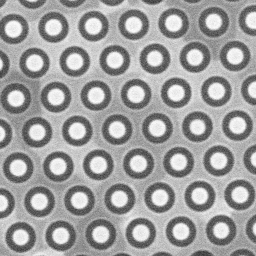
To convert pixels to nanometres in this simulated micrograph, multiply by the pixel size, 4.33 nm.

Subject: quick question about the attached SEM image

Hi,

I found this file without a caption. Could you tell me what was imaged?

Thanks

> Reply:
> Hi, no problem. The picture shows an array of small figures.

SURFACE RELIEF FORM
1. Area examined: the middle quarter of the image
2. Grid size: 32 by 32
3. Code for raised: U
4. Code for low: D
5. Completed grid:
DUUUDDUUUDDUUUDDUUUDDDDDDDUUUDDD
DDDDDDUUUUDDDDDDUUUUDDDDDDUUUUDD
DDDDDUUUUUUDDDDUUUUUUUDDUUUUUUUU
UUUUUUUUUUUUUUUUUUUUUUUUUUUDDUUU
UUUUUUDDDDUUUUUUDDDDUUUUUDDDDDDU
DUUUUDDDDDDUUUUDDDDDDUUUDDDUUDDD
DUUUDDDUUDDDUUDDUUUUDDUUDDUUUUDD
DDUUDDUUUUDDUUDDUUUUDDUUDDUUUUDD
DDUUDDUUUUDDUUDDUUUUDDUUDDDUUUDD
DDUUDDDUUDDDUUUDDDDDDDUUUDDDDDDU
DUUUUDDDDDDUUUUDDDDDDUUUUUDDDDUU
UUUUUUDDDDUUUUUUUUDUUUUUUUUUUUUU
UUUUUUUUUUUUUDUUUUUUUDDDDUUUUUUD
UDDDDDUUUUUDDDDDUUUUDDDDDDUUUUDD
DDDDDDDUUUDDDDDDDUUUDDUUUDDUUDDD
DDUUUDDUUDDDUUUDDUUDDUUUUDDUUDDD
DUUUUDDUUDDUUUUDDUUDDUUUUDDUUDDD
DUUUUDDUUDDDUUUDDUUUDDUUUDDUUUDD
DDUUDDDUUUDDDDDDDUUUDDDDDDUUUUDD
DDDDDDUUUUUDDDDDUUUUUDDDDUUUUUUU
UUDDUUUUUUUUUUDUUUUUUUUUUUUUDUUU
UUUUUUUDDDUUUUDDUDDDDUUUUUDDDDDU
DUUUUUDDDDDUUUUDDDDDDDUUUDDDDDDD
DDUUUDDDUDDDUUUDDUUUDDUUUDDUUUDD
DDUUUDDUUUDDDUUDDUUUDDDUUDDUUUDD
DDDUUDDUUUDDDUUDDUUUDDDUUDDUUUDD
DDUUUDDUUUDDUUUDDUUUDDUUUDDDDDDD
DDUUUDDDDDDDUUUUDDDDDDUUUUDDDDDU
DUUUUUDDDDDUUUUUUDDDUUUUUUUUDUUU
UUUUUUUUUUUUUUUUUUUUUUUDDUUUUUUU
UUDDDUUUUUUUDDDDUUUUUDDDDDDUUUUD
UDDDDDDUUUUDDDDDDUUUDDDDDDDUUUDD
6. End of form